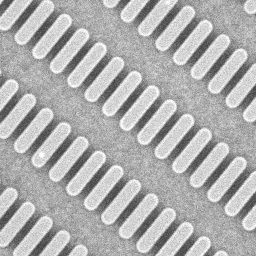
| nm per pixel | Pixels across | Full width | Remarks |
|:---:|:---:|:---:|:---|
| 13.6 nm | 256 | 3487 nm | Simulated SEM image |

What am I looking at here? groups of lines, slits or small figures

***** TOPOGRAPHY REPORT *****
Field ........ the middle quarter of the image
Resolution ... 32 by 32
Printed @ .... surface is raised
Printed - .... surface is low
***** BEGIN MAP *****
@---@@@@---@@@@-----------------
--@@@@@---@@@@------------------
--@@@@---@@@@---@@@-------------
-@@@@---@@@@@---@@@-------------
-@@@@---@@@@---@@@@-------------
--@----@@@@---@@@@--------------
------@@@@---@@@@---@@@@--------
-----@@@@---@@@@@---@@@@--------
------@@@---@@@@---@@@@---------
-----------@@@@---@@@@---@@-----
----------@@@@---@@@@---@@@@----
----------@@@---@@@@@---@@@@----
----------@@@---@@@@---@@@@-----
---------------@@@@---@@@@---@@@
--------------@@@@---@@@@---@@@@
@-------------@@@---@@@@@---@@@@
@-------------------@@@@---@@@@-
@------------------@@@@---@@@@--
---@@-------------@@@@---@@@@---
--@@@@-------------@@---@@@@@---
--@@@@------------------@@@@---@
-@@@@------------------@@@@---@@
@@@@---@@@-------------@@@---@@@
@@@@--@@@@------------------@@@@
@@@---@@@@------------------@@@@
@@---@@@@------------------@@@@-
@---@@@@---@@@--------------@@--
---@@@@@--@@@@@-----------------
--@@@@@---@@@@------------------
--@@@@---@@@@---@@@-------------
-@@@@---@@@@---@@@@-------------
-@@@---@@@@@--@@@@@-------------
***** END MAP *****